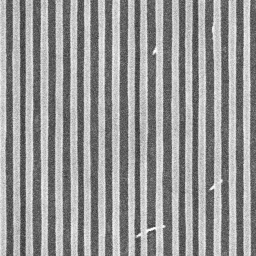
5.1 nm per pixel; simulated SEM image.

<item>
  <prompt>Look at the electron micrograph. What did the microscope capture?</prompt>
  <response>parallel lines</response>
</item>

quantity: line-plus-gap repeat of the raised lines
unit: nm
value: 73.4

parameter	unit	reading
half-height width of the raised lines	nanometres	31.9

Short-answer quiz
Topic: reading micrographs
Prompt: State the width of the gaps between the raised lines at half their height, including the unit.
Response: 41.5 nanometers